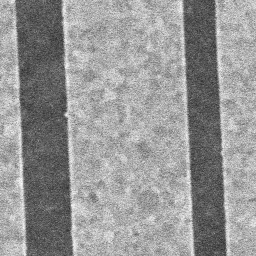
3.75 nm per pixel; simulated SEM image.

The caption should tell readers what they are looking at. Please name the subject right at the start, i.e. one or a few lines or trenches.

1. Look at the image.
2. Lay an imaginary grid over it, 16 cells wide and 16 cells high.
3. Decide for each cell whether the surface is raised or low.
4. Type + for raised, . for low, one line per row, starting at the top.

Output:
+...+++++++...++
+...+++++++...++
+...+++++++...++
+...++++++++..++
+...++++++++..++
+...++++++++..++
+...++++++++..++
+...++++++++..++
+...++++++++..++
+...++++++++..++
+...++++++++..++
+...++++++++..++
+...++++++++..++
+....+++++++..++
++...+++++++..++
++...+++++++..++